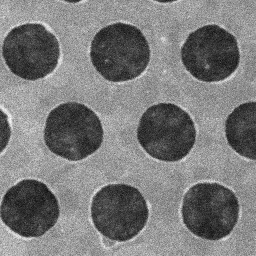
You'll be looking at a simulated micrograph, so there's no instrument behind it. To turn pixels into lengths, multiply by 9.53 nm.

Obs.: holes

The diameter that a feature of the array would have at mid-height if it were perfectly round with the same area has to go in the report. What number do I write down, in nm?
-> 567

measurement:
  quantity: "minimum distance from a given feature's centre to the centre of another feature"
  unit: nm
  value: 851